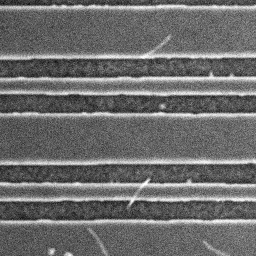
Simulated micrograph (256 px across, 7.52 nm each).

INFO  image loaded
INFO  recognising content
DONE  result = lines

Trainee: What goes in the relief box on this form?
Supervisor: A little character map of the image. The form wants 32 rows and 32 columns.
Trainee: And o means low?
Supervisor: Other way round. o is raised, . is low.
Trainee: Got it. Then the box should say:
................................
oooooooooooooooooooooooooooooooo
oooooooooooooooooooooooooooooooo
oooooooooooooooooooooooooooooooo
oooooooooooooooooooooooooooooooo
oooooooooooooooooooooooooooooooo
oooooooooooooooooooooooooooooooo
................................
................................
................................
oooooooooooooooooooooooooooooooo
oooooooooooooooooooooooooooooooo
................................
................................
oooooooooooooooooooooooooooooooo
oooooooooooooooooooooooooooooooo
oooooooooooooooooooooooooooooooo
oooooooooooooooooooooooooooooooo
oooooooooooooooooooooooooooooooo
oooooooooooooooooooooooooooooooo
oooooooooooo....................
................................
................................
oooooooooooooooooooooooooooooooo
oooooooooooooooooooooooooooooooo
................................
................................
................................
oooooooooooooooooooooooooooooooo
oooooooooooooooooooooooooooooooo
oooooooooooooooooooooooooooooooo
oooooooooooooooooooooooooooooooo